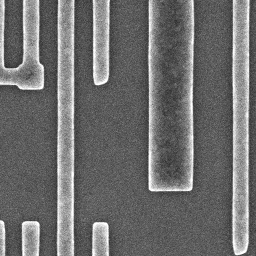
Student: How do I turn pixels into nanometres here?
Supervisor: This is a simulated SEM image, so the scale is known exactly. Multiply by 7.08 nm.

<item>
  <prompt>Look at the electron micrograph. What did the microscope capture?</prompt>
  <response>wiring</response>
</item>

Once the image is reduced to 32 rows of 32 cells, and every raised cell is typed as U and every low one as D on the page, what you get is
DDDUUDDUUDDDUUDDDDDUUUUUDDDDDUUD
DDDUUDDUUDDDUUDDDDDUUUUUDDDDDUUD
DDDUUDDUUDDDUUDDDDDUUUUUDDDDDUUD
DDDUUDDUUDDDUUDDDDDUUUUUDDDDDUUD
DDDUUDDUUDDDUUDDDDDUUUUUDDDDDUUD
DDDUUDDUUDDDUUDDDDDUUUUUDDDDDUUD
DDDUUDDUUDDDUUDDDDDUUUUUDDDDDUUD
DDDUUDDUUDDDUUDDDDDUUUUUDDDDDUUD
UDUUUDDUUDDDUUDDDDDUUUUUDDDDDUUD
UUUUUDDUUDDDUUDDDDDUUUUUDDDDDUUD
UUUUUDDUUDDDUDDDDDDUUUUUDDDDDUUD
DDDDDDDUUDDDDDDDDDDUUUUUDDDDDUUD
DDDDDDDUUDDDDDDDDDDUUUUUDDDDDUUD
DDDDDDDUUDDDDDDDDDDUUUUUDDDDDUUD
DDDDDDDUUDDDDDDDDDDUUUUUDDDDDUUD
DDDDDDDUUDDDDDDDDDDUUUUUDDDDDUUD
DDDDDDDUUDDDDDDDDDDUUUUUDDDDDUUD
DDDDDDDUUDDDDDDDDDDUUUUUDDDDDUUD
DDDDDDDUUDDDDDDDDDDUUUUUDDDDDUUD
DDDDDDDUUDDDDDDDDDDUUUUUDDDDDUUD
DDDDDDDUUDDDDDDDDDDUUUUUDDDDDUUD
DDDDDDDUUDDDDDDDDDDUUUUUDDDDDUUD
DDDDDDDUUDDDDDDDDDDUUUUUDDDDDUUD
DDDDDDDUUDDDDDDDDDDUUUUUDDDDDUUD
DDDDDDDUUDDDDDDDDDDDDDDDDDDDDUUD
DDDDDDDUUDDDDDDDDDDDDDDDDDDDDUUD
DDDDDDDUUDDDDDDDDDDDDDDDDDDDDUUD
DDDDDDDUUDDDDDDDDDDDDDDDDDDDDUUD
UDDUUDDUUDDDUDDDDDDDDDDDDDDDDUUD
UDDUUDDUUDDDUDDDDDDDDDDDDDDDDUUD
UDDUUDDUUDDDUDDDDDDDDDDDDDDDDUUD
UDDUUDDUUDDDUUDDDDDDDDDDDDDDDUUD